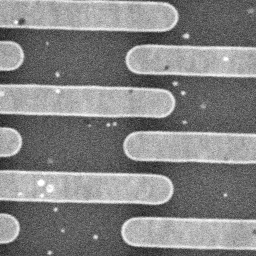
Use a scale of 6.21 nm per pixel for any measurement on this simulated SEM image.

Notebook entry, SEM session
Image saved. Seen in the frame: groups of lines, slits or small figures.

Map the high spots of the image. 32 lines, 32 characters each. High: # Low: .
#####################...........
######################..........
######################..........
........#############...........
................................
##..............................
###.............################
###.............################
##..............################
................................
................................
#####################...........
######################..........
######################..........
.............##..####...........
................................
##..............................
###.............################
##..............################
................################
................................
###.............................
#####################...........
######################..........
#####################...........
................................
................................
##..............#########.......
##.............#################
##.............#################
................################
................................